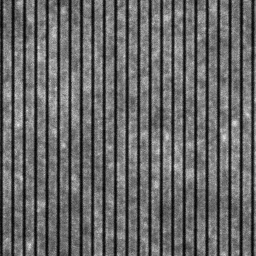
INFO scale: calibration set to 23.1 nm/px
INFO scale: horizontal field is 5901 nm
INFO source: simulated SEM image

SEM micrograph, parallel lines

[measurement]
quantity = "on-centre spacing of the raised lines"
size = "0.263 microns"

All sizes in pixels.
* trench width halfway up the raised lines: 3.75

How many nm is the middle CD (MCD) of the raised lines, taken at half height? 193